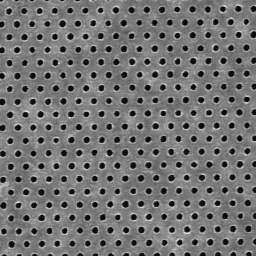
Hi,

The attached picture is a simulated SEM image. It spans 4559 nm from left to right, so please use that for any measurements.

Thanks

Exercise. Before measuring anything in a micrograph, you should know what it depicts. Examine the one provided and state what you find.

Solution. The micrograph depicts a regular array of holes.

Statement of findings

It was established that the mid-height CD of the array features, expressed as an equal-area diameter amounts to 116 nanometers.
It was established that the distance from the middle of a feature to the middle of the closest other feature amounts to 264 nanometers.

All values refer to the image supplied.